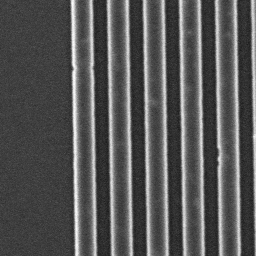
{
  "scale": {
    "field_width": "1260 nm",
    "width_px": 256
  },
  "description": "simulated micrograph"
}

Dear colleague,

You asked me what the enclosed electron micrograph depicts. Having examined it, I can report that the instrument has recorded parallel lines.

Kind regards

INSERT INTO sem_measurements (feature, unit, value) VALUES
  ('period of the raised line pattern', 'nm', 177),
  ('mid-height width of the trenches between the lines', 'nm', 80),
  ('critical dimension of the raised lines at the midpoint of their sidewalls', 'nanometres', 97.8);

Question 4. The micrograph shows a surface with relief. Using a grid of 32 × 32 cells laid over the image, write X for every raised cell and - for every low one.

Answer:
---------XX---XX--XX---XX--XX---
---------XX---XX--XX---XX--XXX--
---------XX---XX--XX---XX--XX---
---------XX---XX--XXX--XX--XX---
---------XX---XX--XXX--XX--XXX--
---------XX---XX--XXX--XX--XX---
---------XXX--XX--XXX--XX--XX---
---------XXX--XX--XXX--XX--XX---
---------XXX--XX--XXX--XX--XXX--
---------XXX--XX--XXX--XX--XXX--
---------XXX--XX--XXX--XX--XXX--
---------XXX--XX--XXX--XX--XXX--
---------XXX--XX--XXX--XX--XXX--
---------XXX--XX--XXX--XX--XXX--
---------XXX--XX--XXX--XX--XXX--
---------XXX--XX--XXX--XX--XXX--
---------XXX--XX--XXX--XX--XXX--
---------XXX--XX--XXX--XX--XXX--
---------XXX--XX--XXX--XX--XXX--
---------XXX--XX--XXX--XX--XXX--
---------XXX--XX--XXX--XX--XXX--
---------XXX--XX--XXX--XX--XXX--
---------XXX--XX--XXX--XX--XXX--
---------XXX--XX--XXX--XX--XXX--
---------XXX--XX--XXX--XX--XXX--
---------XXX--XX--XXX--XX--XXX--
---------XXX--XX--XXX--XX--XXX--
---------XXX--XX---XX--XX--XXX--
---------XXX--XX---XX--XX--XXX--
---------XXX--XX---XX--XX--XXX--
----------XX--XX---XX--XX--XXX--
----------XX--XX---XX--XX---XX--